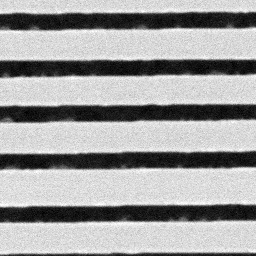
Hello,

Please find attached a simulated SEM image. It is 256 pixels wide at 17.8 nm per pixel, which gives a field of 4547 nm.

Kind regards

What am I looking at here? lines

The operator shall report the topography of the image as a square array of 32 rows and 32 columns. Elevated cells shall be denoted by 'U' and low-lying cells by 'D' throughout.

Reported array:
UUUUUUUUUUUUUUUUUUUUUUUUUUUUUUUU
UUUUUUUUUUUUUUUUUUUUUUUUUUDDUUUD
DDDDDDDDDDDDDDDDDDDDDDDDDDDDDDDD
DDDDDDDDDDDDDDDDDDDDDDDDDDDDDDDD
UUUUUUUUUUUUUUUUUUUUUUUUUUUUUUUU
UUUUUUUUUUUUUUUUUUUUUUUUUUUUUUUU
UUUUUUUUUUUUUUUUUUUUUUUUUUUUUUUU
DDDDDDDDDDDDDDDDDDDDDDDDDDDDDDDD
DDDDDDDDDDDDDDDDDDDDDDDDDDDDDDDD
DDDDDDDDDDDDDDDDDDDUUUUUUUUUUUUU
UUUUUUUUUUUUUUUUUUUUUUUUUUUUUUUU
UUUUUUUUUUUUUUUUUUUUUUUUUUUUUUUU
UUUUUUUUUUUUUUUUUUUUUUUUUUUUUUUU
DDDDDDDDDDDDDDDDDDDDDDDDDDDDDDDD
DDDDDDDDDDDDDDDDDDDDDDDDDDDDDDDD
UUUUUUUUUUUUUUUUUUUUUUUUUUUUUUUU
UUUUUUUUUUUUUUUUUUUUUUUUUUUUUUUU
UUUUUUUUUUUUUUUUUUUUUUUUUUUUUUUU
UUUUUUUUUUUUUUUUUUUUUUUUUUUUUUUU
DDDDDDDDDDDDDDDDDDDDDDDDDDDDDDDD
DDDDDDDDDDDDDDDDDDDDDDDDDDDDDDDD
UUUUUUUUUUUUUUUUUUUUUUUUUUUUUUUU
UUUUUUUUUUUUUUUUUUUUUUUUUUUUUUUU
UUUUUUUUUUUUUUUUUUUUUUUUUUUUUUUU
UUUUUUUUUUUUUUUUUUUUUUUUUUUUUUUU
UUUUUUUUUUUUUUUUUUUUUUUUUUUUUDUU
DDDDDDDDDDDDDDDDDDDDDDDDDDDDDDDD
DDDDDDDDDDDDDDDDDDDDDDDDDDDDDDDD
UUUUUUUUUUUUUUUUUUUUUUUUUUUUUUUU
UUUUUUUUUUUUUUUUUUUUUUUUUUUUUUUU
UUUUUUUUUUUUUUUUUUUUUUUUUUUUUUUU
UUUUUUUUUUUUUUDUUUDDDDDDDDDDDDDD